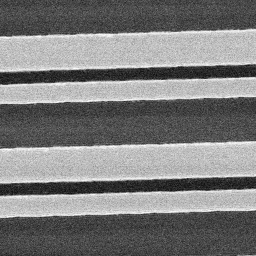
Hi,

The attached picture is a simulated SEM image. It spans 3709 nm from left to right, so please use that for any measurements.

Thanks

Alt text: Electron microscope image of lines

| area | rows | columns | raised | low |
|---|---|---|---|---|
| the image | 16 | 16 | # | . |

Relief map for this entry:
................
................
################
################
################
################
................
................
................
################
################
################
################
#...............
................
................